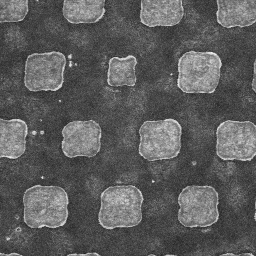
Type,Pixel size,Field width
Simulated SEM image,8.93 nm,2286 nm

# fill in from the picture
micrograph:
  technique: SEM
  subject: raised bodies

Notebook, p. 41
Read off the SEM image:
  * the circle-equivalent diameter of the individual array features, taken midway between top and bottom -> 390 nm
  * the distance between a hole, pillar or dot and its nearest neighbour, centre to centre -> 684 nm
